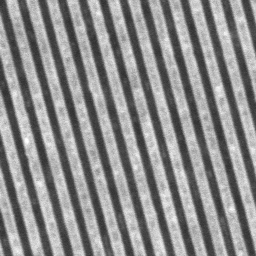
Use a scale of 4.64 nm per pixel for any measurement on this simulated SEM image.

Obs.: parallel lines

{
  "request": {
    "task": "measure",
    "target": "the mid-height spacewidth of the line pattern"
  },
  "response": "0.0454 micrometres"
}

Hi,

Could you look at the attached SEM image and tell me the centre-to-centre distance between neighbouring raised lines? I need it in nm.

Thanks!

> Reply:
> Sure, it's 91.1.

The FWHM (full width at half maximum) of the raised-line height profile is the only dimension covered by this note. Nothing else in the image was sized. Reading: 9.78 pixels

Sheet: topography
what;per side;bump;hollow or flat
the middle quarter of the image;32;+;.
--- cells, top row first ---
+++..+++..+++..+++..+++...++...+
+++..+++...++...++...++...++...+
.++...++...++...++...+++..+++..+
.+++..+++..+++..+++..+++..+++..+
.+++..+++..+++..+++..+++...++...
.+++..+++...++...++...++...+++..
..++...++...++...++...++...+++..
..++...+++..+++..+++..+++...++..
..+++..+++..+++...++...++...++..
..+++...++...++...++...++...+++.
...++...++...++...+++..+++..+++.
+..++...+++..+++..+++..+++..+++.
+..+++...++...++...++...++...++.
+..+++...++...++...++...+++..+++
+...++...++...+++..+++..+++..+++
++..++...+++..+++..+++..+++..+++
++..+++...++...++...++...++...++
++...++...++...++...++...++...++
++...++...++...+++..+++..+++..++
+++..+++..+++..+++..+++..+++...+
+++..+++..+++...++...++...++...+
.++...++...++...++...++...+++..+
.++...+++..+++..+++..+++..+++..+
.+++..+++..+++..+++...++...++...
.+++..+++...++...++...++...++...
..++...++...++...++...+++..+++..
..++...+++..+++..+++..+++..+++..
..+++..+++..+++...++...++...++..
..+++..+++...++...++...++...++..
...++...++...+++..+++..+++..+++.
...++...+++..+++..+++..+++..+++.
+..+++..+++..+++...++...++...++.